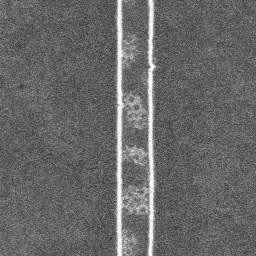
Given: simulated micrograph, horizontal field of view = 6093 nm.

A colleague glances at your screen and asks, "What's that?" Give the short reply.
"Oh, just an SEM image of one or a few lines or trenches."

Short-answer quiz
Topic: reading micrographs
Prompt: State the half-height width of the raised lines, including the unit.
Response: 747 nanometers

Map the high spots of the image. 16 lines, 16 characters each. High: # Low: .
.......##.......
.......##.......
.......##.......
.......##.......
.......##.......
.......##.......
........#.......
.......##.......
.......##.......
.......##.......
.......##.......
.......##.......
.......##.......
.......##.......
.......##.......
.......##.......